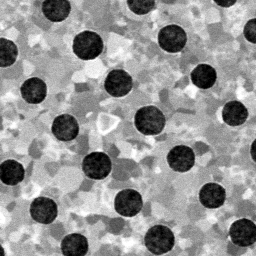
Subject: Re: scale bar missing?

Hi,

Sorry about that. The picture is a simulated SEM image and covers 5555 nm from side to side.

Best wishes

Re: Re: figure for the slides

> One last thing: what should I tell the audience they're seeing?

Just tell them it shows a regular array of holes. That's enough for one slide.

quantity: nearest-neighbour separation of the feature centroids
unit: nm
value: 1060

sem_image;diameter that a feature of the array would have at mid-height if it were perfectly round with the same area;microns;0.631